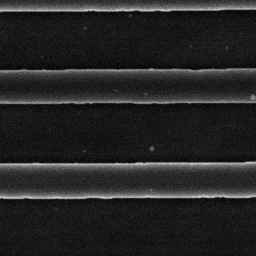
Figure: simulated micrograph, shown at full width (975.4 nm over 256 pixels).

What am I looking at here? lines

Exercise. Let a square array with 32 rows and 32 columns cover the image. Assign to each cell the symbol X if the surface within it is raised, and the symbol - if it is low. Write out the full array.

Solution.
XXXXXXXXXXXXXXXXXXXXXXXXXXXXXXXX
--------------------------------
--------------------------------
--------------------------------
--------------------------------
--------------------------------
--------------------------------
--------------------------------
--------------------------------
XXXXXXXXXXXXXXXXXXXXXXXXXXXXXXXX
XXXXXXXXXXXXXXXXXXXXXXXXXXXXXXXX
XXXXXXXXXXXXXXXXXXXXXXXXXXXXXXXX
XXXXXXXXXXXXXXXXXXXXXXXXXXXXXXXX
--------------------------------
--------------------------------
--------------------------------
--------------------------------
--------------------------------
--------------------------------
--------------------------------
--------------X--XXXXXXXXXXXXXXX
XXXXXXXXXXXXXXXXXXXXXXXXXXXXXXXX
XXXXXXXXXXXXXXXXXXXXXXXXXXXXXXXX
XXXXXXXXXXXXXXXXXXXXXXXXXXXXXXXX
XXXXXXXXXXXXXXXXXXXXXXXXXXXXXXXX
--------------------------------
--------------------------------
--------------------------------
--------------------------------
--------------------------------
--------------------------------
--------------------------------